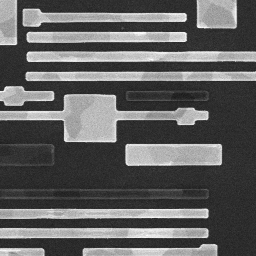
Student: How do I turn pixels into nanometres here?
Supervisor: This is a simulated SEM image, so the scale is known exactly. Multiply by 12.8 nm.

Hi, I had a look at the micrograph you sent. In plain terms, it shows wiring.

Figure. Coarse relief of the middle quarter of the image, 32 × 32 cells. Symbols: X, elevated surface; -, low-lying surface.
--------------------------------
--------------------------------
XXXXXXXXXXXXXXXXXXXXXXXXXXXXXXXX
XXXXXXXXXXXXXXXXXXXXXXXXXXXXXXXX
--------------------------------
--------------------------------
--------------------------------
----------------XXXXXXXXXXXXXXXX
XXXXXXXXXXXXX---XXXXXXXXXXXXXXXX
XXXXXXXXXXXXX-------------------
XXXXXXXXXXXXX-------------------
XXXXXXXXXXXXX---------------XXXX
XXXXXXXXXXXXXXXXXXXXXXXXXXXXXXXX
XXXXXXXXXXXXXXXXXXXXXXXXXXXXXXXX
XXXXXXXXXXXXX---------------XXXX
XXXXXXXXXXXXX-------------------
XXXXXXXXXXXXX-------------------
XXXXXXXXXXXXX-------------------
XXXXXXXXXXXXX-------------------
--------------------------------
----------------XXXXXXXXXXXXXXXX
----------------XXXXXXXXXXXXXXXX
----------------XXXXXXXXXXXXXXXX
----------------XXXXXXXXXXXXXXXX
----------------XXXXXXXXXXXXXXXX
--------------------------------
--------------------------------
--------------------------------
--------------------------------
--------------------------------
--------------------------------
XXXXXXXXXXXXXXXXXXXXXXXXXXXXXXXX